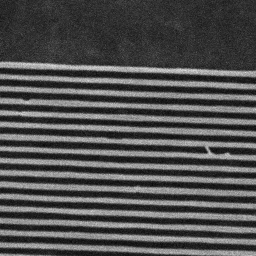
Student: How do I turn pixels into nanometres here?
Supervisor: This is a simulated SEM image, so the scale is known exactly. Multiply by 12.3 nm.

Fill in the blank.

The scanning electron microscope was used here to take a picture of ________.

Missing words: parallel lines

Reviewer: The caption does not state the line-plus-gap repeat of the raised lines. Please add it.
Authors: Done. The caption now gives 148 nanometers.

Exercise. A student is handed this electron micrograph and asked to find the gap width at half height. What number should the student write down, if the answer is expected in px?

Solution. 7.37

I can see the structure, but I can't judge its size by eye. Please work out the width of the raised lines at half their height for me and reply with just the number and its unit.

57 nanometers